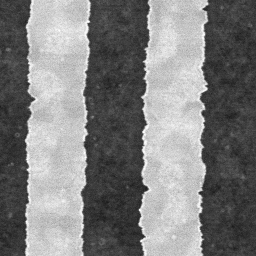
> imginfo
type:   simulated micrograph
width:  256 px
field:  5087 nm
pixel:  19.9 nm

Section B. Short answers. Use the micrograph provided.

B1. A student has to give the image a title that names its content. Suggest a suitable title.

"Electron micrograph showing one or a few lines or trenches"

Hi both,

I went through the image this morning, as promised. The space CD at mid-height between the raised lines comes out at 59.4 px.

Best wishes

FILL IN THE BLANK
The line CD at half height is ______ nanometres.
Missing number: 1140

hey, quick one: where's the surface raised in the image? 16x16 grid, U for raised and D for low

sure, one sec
DDUUUUDDDUUUUDDD
DDUUUDDDDUUUUDDD
DDUUUDDDDUUUUDDD
DDUUUUDDDUUUUDDD
DDUUUDDDDUUUUDDD
DDUUUDDDDUUUUDDD
DDUUUDDDDUUUUDDD
DDUUUDDDDUUUUDDD
DDUUUDDDDUUUUDDD
DDUUUDDDDUUUUDDD
DDUUUDDDDUUUUDDD
DDUUUDDDDUUUUDDD
DDUUUDDDDUUUDDDD
DDUUUDDDDUUUDDDD
DDUUUDDDDUUUUDDD
DDUUUDDDDUUUUDDD